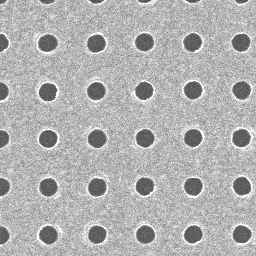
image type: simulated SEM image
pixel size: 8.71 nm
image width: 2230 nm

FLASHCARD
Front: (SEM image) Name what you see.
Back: a regular array of holes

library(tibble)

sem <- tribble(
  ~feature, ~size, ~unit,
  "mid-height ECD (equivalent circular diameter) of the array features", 154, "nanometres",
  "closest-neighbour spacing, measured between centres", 416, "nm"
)